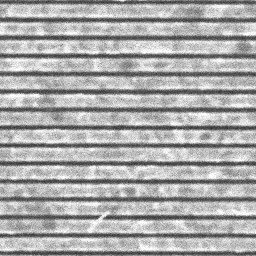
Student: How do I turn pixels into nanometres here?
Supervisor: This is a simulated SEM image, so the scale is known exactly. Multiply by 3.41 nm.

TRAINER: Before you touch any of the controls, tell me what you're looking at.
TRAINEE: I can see parallel lines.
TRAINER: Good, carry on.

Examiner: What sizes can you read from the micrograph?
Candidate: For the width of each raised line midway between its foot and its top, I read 42.7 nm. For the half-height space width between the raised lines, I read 20.1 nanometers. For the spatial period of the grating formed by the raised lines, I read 61.3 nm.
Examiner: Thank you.